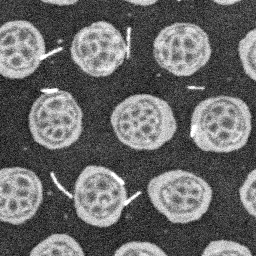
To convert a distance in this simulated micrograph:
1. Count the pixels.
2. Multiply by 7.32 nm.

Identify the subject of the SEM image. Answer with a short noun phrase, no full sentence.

raised bodies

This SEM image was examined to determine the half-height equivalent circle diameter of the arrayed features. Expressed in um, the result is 0.383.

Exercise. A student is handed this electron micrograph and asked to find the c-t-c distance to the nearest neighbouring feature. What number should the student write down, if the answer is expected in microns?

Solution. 0.599